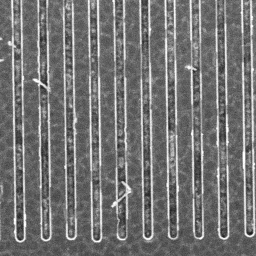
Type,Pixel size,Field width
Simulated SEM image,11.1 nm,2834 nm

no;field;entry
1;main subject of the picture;parallel lines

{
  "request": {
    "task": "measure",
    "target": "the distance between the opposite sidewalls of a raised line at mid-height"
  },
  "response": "190 nanometers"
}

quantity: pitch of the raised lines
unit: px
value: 25.5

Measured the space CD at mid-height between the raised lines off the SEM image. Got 89.9 nm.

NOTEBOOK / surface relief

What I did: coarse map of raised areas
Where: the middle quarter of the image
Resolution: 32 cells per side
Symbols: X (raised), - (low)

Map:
--XXXX---XXXX--XXXX---XXXX--XXXX
--XXXX---XXXX--XXXX---XXXX--XXXX
--XXXX---XXXX--XXXX---XXXX--XXXX
--XXXX---XXXX--XXXX---XXXX--XXXX
--XXXX---XXXX--XXXX---XXXX--XXXX
--XXXXX--XXXX--XXXX---XXXX--XXXX
--XXXXX--XXXX--XXXX---XXXX--XXXX
--XXXXX--XXXX--XXXX---XXXX--XXXX
---XXXX--XXXX--XXXX---XXXX--XXXX
---XXXX--XXXX--XXXX---XXXX--XXXX
---XXXX--XXXX--XXXX---XXXX--XXXX
---XXXX--XXXX--XXXX---XXXX--XXXX
---XXXX--XXXX--XXXX---XXXX--XXXX
---XXXX--XXXX--XXXX---XXXX--XXXX
--XXXXX--XXXX--XXXX---XXXX--XXXX
--XXXXX--XXXX--XXXXX--XXXX--XXXX
--XXXXX--XXXX--XXXXX--XXXX--XXXX
---XXXX--XXXX--XXXXX--XXXX--XXXX
---XXXX--XXXX--XXXXX--XXXX--XXXX
---XXXX--XXXX--XXXXX--XXXX--XXXX
---XXXX--XXXX---XXXX--XXXX--XXXX
---XXXX--XXXX---XXXX--XXXX--XXXX
---XXXX--XXXX---XXXX--XXXX--XXXX
---XXXX--XXXX---XXXX--XXXX--XXXX
---XXXX--XXXX---XXXX--XXXX--XXXX
---XXXX--XXXX---XXXX--XXXX--XXXX
X--XXXX--XXXX---XXXX--XXXX--XXXX
X--XXXX--XXXX---XXXX--XXXX--XXXX
X--XXXX--XXXX---XXXX--XXXX--XXXX
X--XXXX--XXXX--XXXXX--XXXX--XXXX
X--XXXX--XXXX--XXXXX--XXXX--XXXX
X--XXXX--XXXX---XXXX--XXXX--XXXX